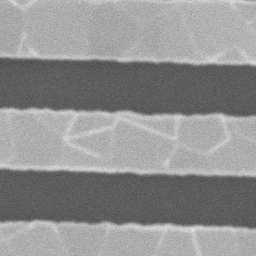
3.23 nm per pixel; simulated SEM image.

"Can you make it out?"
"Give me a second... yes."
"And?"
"lines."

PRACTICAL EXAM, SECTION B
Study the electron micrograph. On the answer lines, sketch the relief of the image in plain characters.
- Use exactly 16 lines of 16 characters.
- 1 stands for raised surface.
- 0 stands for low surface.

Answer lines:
1111111111111111
1111111111111111
1111111111111111
1111111111111111
0000000000000000
0000000000000000
0000000000000000
1111111111111111
1111111111111111
1111111111111111
1111111111111111
0000000000000000
0000000000000000
0000000000000000
1111111111111111
1111111111111111